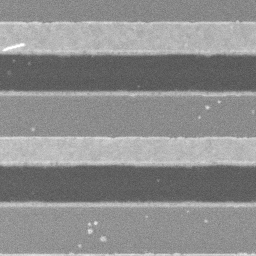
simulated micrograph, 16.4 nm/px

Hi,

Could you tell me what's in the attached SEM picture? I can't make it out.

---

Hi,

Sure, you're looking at lines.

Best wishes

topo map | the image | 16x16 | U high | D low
UUUUUUUUUUUUUUUU
UUUUUUUUUUUUUUUU
UUUUUUUUUUUUUUUU
DDDDDDDDDDDDDDDD
DDDDDDDDDDDDDDDD
DDDDDDDDDDDDDDDD
UUUUUUUUUUUUUUUU
UUUUUUUUUUUUUUUU
UUUUUUUUUUUUUUUU
UUUUUUUUUUUUUUUU
DDDDDDDDDDDDDDDD
DDDDDDDDDDDDDDDD
DDDDDDDDDDDDDDDD
UUUUUUUUUUUUUUUU
UUUUUUUUUUUUUUUU
UUUUUUUUUUUUUUUU